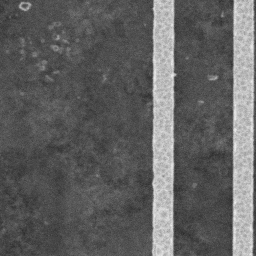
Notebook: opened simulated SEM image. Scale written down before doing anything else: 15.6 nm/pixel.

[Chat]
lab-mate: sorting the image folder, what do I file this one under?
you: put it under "one or a few lines or trenches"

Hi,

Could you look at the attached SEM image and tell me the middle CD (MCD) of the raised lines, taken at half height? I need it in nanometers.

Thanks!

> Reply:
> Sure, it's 296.